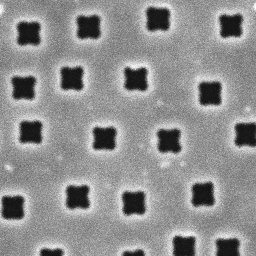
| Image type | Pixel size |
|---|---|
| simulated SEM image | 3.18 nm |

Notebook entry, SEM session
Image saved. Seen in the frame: a regular array of holes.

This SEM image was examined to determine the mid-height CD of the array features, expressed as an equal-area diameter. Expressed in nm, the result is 82.5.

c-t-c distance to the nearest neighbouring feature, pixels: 62.6